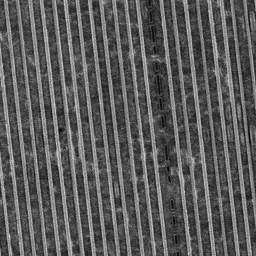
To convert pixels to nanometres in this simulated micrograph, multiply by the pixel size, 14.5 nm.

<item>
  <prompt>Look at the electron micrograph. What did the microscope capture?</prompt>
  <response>parallel lines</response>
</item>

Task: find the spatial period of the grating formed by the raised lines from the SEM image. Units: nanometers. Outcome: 173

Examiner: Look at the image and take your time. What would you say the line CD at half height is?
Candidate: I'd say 43.4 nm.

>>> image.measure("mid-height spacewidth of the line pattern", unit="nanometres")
132